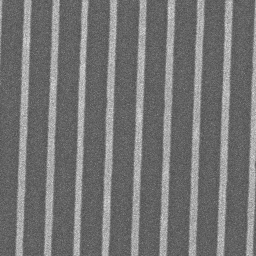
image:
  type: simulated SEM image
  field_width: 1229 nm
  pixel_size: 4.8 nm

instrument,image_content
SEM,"parallel lines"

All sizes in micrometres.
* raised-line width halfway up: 0.0318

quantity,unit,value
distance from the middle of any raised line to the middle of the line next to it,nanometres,138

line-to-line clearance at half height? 0.109 micrometres